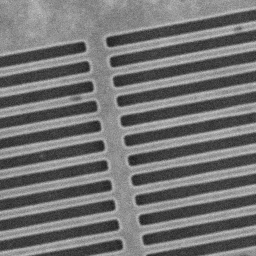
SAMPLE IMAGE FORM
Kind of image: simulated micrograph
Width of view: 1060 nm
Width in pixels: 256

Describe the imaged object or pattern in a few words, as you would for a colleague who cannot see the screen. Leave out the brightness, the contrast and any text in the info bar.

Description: groups of lines, slits or small figures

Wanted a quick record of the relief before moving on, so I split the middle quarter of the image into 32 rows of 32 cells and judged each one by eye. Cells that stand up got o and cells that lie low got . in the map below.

.......ooooo...ooooooooooo......
......ooooooooooooooo...........
....ooooooooooo................o
oooooooooooo...............ooooo
oooo...ooooo.........ooooooooooo
........ooooo...oooooooooo......
........ooooooooooooo...........
.....ooooooooooo................
ooooooooooooo...............oooo
oooo....ooooo........ooooooooooo
........ooooo...ooooooooooo.....
........oooooooooooooo..........
.....ooooooooooo................
oooooooooooooo..............oooo
ooooo....ooooo.........ooooooooo
.........ooooo...oooooooooo.....
.........oooooooooooooo.........
......oooooooooo................
.oooooooooooooo.............oooo
ooooo.....ooooo........ooooooooo
..........oooooo.ooooooooooo....
..........oooooooooooooo........
......ooooooooooo...............
..oooooooooooooo.............ooo
ooooooo....ooooo........oooooooo
o..........oooooo.ooooooooooo...
...........ooooooooooooo........
.......ooooooooooo..............
..ooooooooooooooo.............oo
oooooooo....ooooo........ooooooo
oo..........oooooo.oooooooooo...
............oooooooooooo........